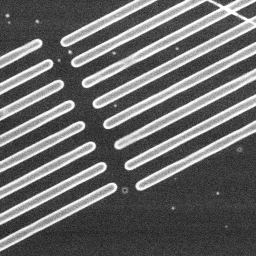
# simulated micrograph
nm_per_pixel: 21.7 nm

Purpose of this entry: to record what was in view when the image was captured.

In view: groups of lines, slits or small figures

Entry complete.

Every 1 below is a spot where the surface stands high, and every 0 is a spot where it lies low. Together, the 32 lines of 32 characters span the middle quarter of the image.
00110000000011110000000011111000
00000000001111000000001111100000
00000000111100000000111110000000
00000011110000000011111000000001
00000111000000001111100000000111
00000100000000111110000000011111
00000000000001111100000000111100
00000000000111110000000011110000
00000000011111000000001111000000
11000001111100000000111100000000
11000000110000000111110000000011
11000000000000011111000000001111
00000000000000111100000000111110
00000000000011110000000011111000
00000000001111000000001111100000
00111000001110000000011110000000
11110000000000000001111000000001
11000000000000000111100000000111
00000000000000011110000000011111
00000000000001111000000001111100
00000111000001100000000111110000
00011110000000000000011111000000
01111000000000000000111100000000
11100000000000000011110000000001
10000000000000001111000000000111
00000000110000011100000000111110
00000011110000000000000011111000
00001111100000000000000111100000
00111100000000000000011110000000
11110000000000000001111000000000
11000000001110000011100000000000
10000000111110000000000000000000